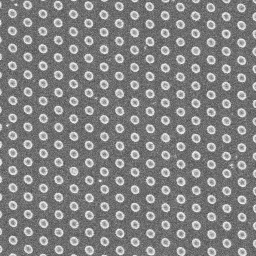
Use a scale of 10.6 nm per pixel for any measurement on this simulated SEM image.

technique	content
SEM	a regular array of raised bodies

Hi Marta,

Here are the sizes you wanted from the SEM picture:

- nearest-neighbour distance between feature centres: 17.3 px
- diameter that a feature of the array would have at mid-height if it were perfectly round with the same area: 85.3 nm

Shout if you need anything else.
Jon